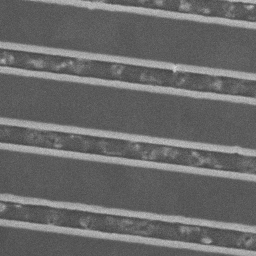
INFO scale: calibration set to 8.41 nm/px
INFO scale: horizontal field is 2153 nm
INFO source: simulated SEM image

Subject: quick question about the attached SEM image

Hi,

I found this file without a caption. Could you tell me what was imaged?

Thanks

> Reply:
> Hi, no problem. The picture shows one or a few lines or trenches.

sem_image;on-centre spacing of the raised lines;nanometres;637